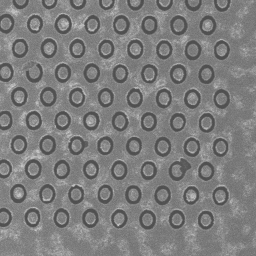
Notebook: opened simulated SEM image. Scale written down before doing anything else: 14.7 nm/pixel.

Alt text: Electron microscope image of a regular array of ring-shaped grooves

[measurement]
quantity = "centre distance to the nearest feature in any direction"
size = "0.404 µm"